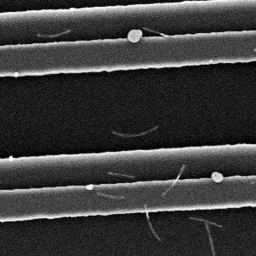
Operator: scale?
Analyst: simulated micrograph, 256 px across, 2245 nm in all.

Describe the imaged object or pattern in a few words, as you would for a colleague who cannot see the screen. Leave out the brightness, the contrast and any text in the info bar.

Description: lines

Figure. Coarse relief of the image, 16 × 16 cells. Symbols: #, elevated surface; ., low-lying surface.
......##########
################
################
################
###.............
................
................
................
................
........########
################
################
################
####............
................
................